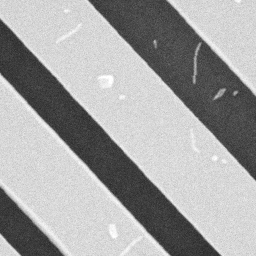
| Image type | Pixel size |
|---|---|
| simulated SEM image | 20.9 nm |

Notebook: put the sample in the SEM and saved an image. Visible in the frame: lines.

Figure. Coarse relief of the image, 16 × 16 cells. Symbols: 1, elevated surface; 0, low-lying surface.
1111110000011111
1111111000001111
0111111100000111
0011111110000011
0001111111000001
1000111111100000
1100011111100000
1110001111110000
1111000111111000
1111100011111100
1111110001111110
1111110000111111
0111111000011111
0011111100001111
0001111110001111
1000111111000111